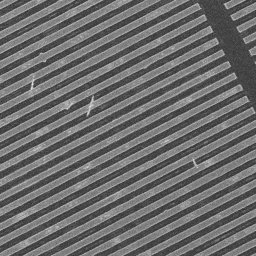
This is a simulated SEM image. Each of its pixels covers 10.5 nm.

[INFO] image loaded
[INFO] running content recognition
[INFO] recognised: parallel lines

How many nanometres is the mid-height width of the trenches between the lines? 65.2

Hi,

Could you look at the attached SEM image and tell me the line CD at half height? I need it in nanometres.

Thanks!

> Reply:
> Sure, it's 73.3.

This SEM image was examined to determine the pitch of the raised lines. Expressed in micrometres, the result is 0.137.